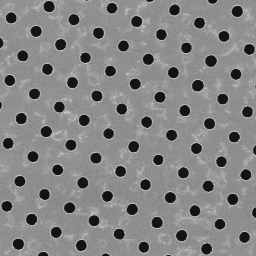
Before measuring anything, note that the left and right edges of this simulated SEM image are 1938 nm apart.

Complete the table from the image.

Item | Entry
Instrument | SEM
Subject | a regular array of holes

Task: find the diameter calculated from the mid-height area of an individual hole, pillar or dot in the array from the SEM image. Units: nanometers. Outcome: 82.3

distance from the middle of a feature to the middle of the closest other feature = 210 nm